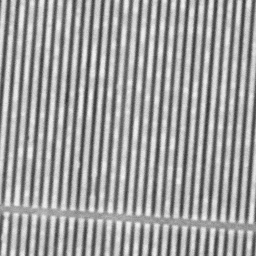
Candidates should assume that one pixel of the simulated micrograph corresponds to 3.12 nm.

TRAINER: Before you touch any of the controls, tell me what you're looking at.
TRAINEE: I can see parallel lines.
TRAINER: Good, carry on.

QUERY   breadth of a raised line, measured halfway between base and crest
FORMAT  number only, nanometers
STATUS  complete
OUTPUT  17.1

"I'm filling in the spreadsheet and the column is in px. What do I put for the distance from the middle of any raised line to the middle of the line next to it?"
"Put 9.39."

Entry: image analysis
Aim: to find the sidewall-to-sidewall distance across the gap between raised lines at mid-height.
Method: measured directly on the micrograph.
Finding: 14.4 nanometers